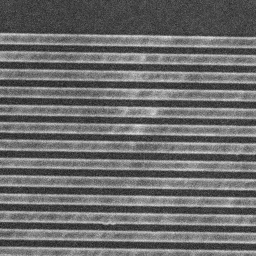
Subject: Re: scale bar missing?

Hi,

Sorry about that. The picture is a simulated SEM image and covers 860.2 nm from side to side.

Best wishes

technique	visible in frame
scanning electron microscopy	parallel lines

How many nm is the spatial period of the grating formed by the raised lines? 59.6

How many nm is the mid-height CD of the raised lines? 35.6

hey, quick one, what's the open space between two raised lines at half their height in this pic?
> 0.026 µm